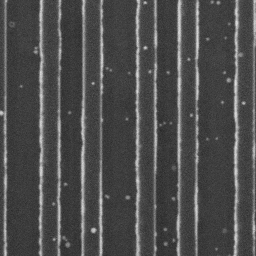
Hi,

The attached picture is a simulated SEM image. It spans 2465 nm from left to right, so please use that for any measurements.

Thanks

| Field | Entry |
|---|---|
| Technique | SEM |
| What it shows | lines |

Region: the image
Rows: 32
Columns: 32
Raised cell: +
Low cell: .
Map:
+....+++..+++....++...+++.....++
+....+++..+++....++...+++....+++
+....++...+++....++...+++.....++
+....++...+++....++...+++.....++
+....+++..+++....++...+++....+++
+....+++..+++....++...+++....+++
+....+++..+++....++...+++.....++
+....++...+++....++...+++.....++
+....++...+++....++...+++.....++
+....++...+++....++...+++....+++
+....++...+++....++...+++....+++
+....++...+++....++...+++....+++
+....++...+++....++...+++....+++
+....++...+++....++...+++....+++
+....++...+++....++...+++....+++
+....++...+++....++...+++.....++
+....++...+++....++...+++.....++
+....++...+++....++...+++.....++
+....++...+++....++...+++....+++
+....++...+++....++...+++....+++
+....++...+++....++...+++....+++
+....++...+++....++...+++....+++
+....++...+++....++...+++....+++
+....++...+++....++...+++.....++
+....++...+++....++...+++.....++
+....++...+++....++...+++....+++
+....++...+++....++...+++....+++
+....++...+++....++...+++....+++
+....++...+++....++...+++....+++
+....++...+++....++...+++....+++
+....++...+++....++...+++....+++
+....++...+++....++...+++....+++